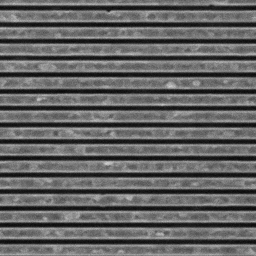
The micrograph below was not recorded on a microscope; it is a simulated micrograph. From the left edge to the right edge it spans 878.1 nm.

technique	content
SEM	parallel lines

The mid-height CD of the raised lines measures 38.1 nm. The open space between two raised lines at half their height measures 17.6 nanometres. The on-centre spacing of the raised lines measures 57.1 nanometres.